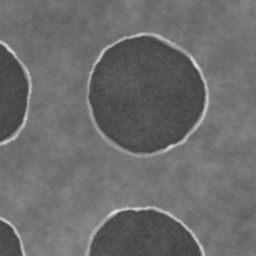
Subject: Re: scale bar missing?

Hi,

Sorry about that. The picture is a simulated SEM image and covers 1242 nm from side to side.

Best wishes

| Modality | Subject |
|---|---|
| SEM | holes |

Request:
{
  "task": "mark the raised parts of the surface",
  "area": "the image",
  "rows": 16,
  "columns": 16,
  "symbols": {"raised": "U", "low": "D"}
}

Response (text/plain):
UUUUUUUUUUUUUUUU
UUUUUUUUUUUUUUUU
UUUUUUUUDDUUUUUU
DUUUUUDDDDDDUUUU
DDUUUUDDDDDDUUUU
DDUUUUDDDDDDDUUU
DDUUUUDDDDDDDUUU
DUUUUUDDDDDDUUUU
DUUUUUUDDDDDUUUU
UUUUUUUUDDUUUUUU
UUUUUUUUUUUUUUUU
UUUUUUUUUUUUUUUU
UUUUUUUUUUUUUUUU
UUUUUUUDDDUUUUUU
DUUUUUDDDDDDUUUU
DUUUUUDDDDDDUUUU